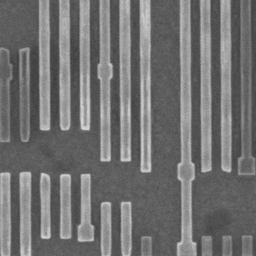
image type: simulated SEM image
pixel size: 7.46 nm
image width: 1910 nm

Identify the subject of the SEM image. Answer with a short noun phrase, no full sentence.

wiring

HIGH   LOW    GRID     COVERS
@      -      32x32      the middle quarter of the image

@---@@---@@@--@@@--@@--------@@-
@---@@---@@@--@@@--@@--------@@-
@---@@---@@@--@@@--@@--------@@-
@---@@---@@@--@@@--@@@-------@@-
@---@@---@@---@@@--@@@-------@@-
@---@@---@@---@@@--@@@-------@@-
@---@@---@@---@@@--@@@-------@@-
@---@@---@@---@@@--@@@-------@@-
@---@@---@@---@@@--@@@-------@@-
@---@@---@@---@@@--@@@-------@@@
@---@@---@@---@@@--@@@-------@@@
@---@@---@@---@@@--@@@-------@@@
@---@@---@@---@@@--@@@-------@@@
@---@@---@@---@@@--@@@-------@@@
@---@@---@@---@@@--@@@-------@@-
@---@@---@@---@@@--@@@-------@@-
---------@@---@@@--@@@-------@@-
---------@@---@@@--@@@--------@-
---------@@---@@@--@@@--------@-
---------@@---@@@--@@@--------@-
---------@@@--@@@--@@@--------@-
---------@@@--@@@--@@@--------@-
---------@@@--@@@--@@@--------@-
---------@@@--@@@--@@@--------@@
-------------------@@@-------@@@
-------------------@@@-------@@@
-------------------@@@-------@@@
-----------------------------@@@
@@--@@-----------------------@@@
@@--@@-----------------------@@@
@@--@@------------------------@@
@@--@@------------------------@@